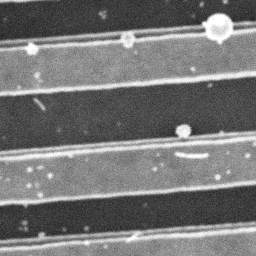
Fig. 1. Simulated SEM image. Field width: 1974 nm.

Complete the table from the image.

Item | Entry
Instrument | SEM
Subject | lines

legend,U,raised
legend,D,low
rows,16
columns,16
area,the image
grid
DDDDDDDDDDDDDDDD
DDDDDDDDDDDDDUUU
DUUUUUUUUUUUUUUU
UUUUUUUUUUUUUUUU
UUUUUUUUUUUUUUUU
UUUUUUUDDDDDDDDD
DDDDDDDDDDDDDDDD
DDDDDDDDDDDDDDDD
DDDDDDDDDDDUDUUU
UUUUUUUUUUUUUUUU
UUUUUUUUUUUUUUUU
UUUUUUUUUUUUUUUU
UUUUDDDDDDDDDDDD
DDDDDDDDDDDDDDDD
DDDDDDDDUUUUUUUU
UUUUUUUUUUUUUUUU